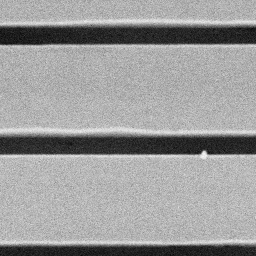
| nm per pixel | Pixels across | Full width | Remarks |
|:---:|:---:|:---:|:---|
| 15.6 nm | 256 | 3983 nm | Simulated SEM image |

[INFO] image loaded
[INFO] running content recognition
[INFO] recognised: lines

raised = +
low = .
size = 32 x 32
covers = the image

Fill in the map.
++++++++++++++++++++++++++++++++
++++++++++++++++++++++++++++++++
++++++++++++++++++++++++++++++++
................................
................................
................................
++++++++++++++++++++++++++++++++
++++++++++++++++++++++++++++++++
++++++++++++++++++++++++++++++++
++++++++++++++++++++++++++++++++
++++++++++++++++++++++++++++++++
++++++++++++++++++++++++++++++++
++++++++++++++++++++++++++++++++
++++++++++++++++++++++++++++++++
++++++++++++++++++++++++++++++++
++++++++++++++++++++++++++++++++
++++++++++++++++++++++++++++++++
................................
................................
++++++++++++++++++++++++++++++++
++++++++++++++++++++++++++++++++
++++++++++++++++++++++++++++++++
++++++++++++++++++++++++++++++++
++++++++++++++++++++++++++++++++
++++++++++++++++++++++++++++++++
++++++++++++++++++++++++++++++++
++++++++++++++++++++++++++++++++
++++++++++++++++++++++++++++++++
++++++++++++++++++++++++++++++++
++++++++++++++++++++++++++++++++
++++++++++++++++++++++++++++++++
................................